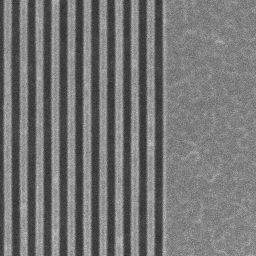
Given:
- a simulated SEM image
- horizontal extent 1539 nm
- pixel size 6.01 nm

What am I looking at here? parallel lines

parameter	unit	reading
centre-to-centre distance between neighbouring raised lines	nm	95.4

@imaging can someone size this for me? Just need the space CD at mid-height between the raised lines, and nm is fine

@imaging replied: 53.4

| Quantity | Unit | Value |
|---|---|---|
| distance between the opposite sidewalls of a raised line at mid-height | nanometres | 40.6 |